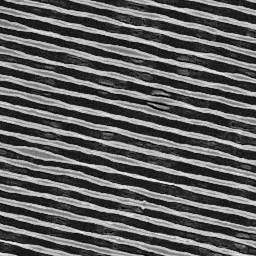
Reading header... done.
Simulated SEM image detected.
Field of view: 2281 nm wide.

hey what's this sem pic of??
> parallel lines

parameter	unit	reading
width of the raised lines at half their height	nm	34.7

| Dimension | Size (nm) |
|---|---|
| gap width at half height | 82.5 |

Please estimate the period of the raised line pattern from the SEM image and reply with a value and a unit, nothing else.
118 nanometers